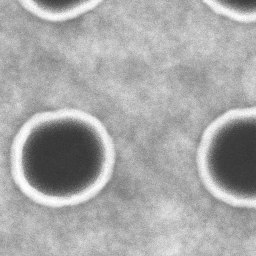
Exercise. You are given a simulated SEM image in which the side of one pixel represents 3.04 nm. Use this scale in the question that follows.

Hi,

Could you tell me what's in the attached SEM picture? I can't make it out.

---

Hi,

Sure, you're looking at raised bodies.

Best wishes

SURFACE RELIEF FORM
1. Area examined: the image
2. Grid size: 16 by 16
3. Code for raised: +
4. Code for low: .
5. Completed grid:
..+++.........++
................
................
................
................
................
................
..++++........++
.++++++......+++
.++++++......+++
.++++++......+++
.+++++.......+++
...++.........++
................
................
................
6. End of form